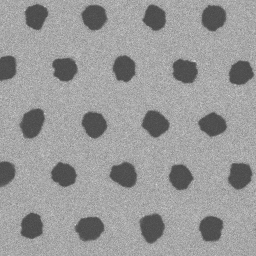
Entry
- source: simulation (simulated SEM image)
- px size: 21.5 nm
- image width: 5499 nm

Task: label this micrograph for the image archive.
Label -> a regular array of holes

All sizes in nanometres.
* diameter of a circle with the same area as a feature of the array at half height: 522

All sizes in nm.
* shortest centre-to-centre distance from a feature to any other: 1250